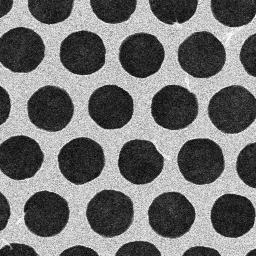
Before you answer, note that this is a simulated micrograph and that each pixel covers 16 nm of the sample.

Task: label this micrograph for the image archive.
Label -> a regular array of holes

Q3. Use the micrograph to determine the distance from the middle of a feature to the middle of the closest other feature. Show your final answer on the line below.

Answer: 949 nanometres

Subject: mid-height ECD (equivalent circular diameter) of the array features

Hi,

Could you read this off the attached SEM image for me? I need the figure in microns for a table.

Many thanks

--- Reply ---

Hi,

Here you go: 0.732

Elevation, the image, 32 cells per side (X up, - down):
--X------XX------XX------X------
-XXX-----XXX-----XX-----XXX-----
XXXXX---XXXXX---XXXX---XXXX----X
XX-XXXXXXXXXXXXXXXXXXXXXXXXXXXXX
-----XXX----XXXX---XXXXX---XXXX-
-----XXX-----XX-----XXX-----XX--
------XX-----XX------X------XX--
-----XXX-----XX-----XX------XX--
X----XXX-----XX-----XXX-----XX--
XXXXXXXXXXXXXXXXX--XXXXX---XXXXX
XXXXXXXXXXXXXXXXXXXXXXXXXXXXXXXX
-XXXX---XXXX----XXXX----XXX----X
-XXX-----XX------XX------X------
-XX------XX------XX------X------
-XXX-----XX------XX------X------
XXXX----XXXX----XXXX----XXX----X
XXXXXXXXXXXXXXXXXXXXXXXXXXXX--XX
X---XXXXX---XXXX--XXXXXX--XXXXXX
-----XXX-----XX-----XXX----XXX--
-----XX------XX-----XX------XX--
-----XX------XX-----XX------X---
-----XXX-----XX-----XXX-----XX--
XXXXXXXX----XXXX---XXXX----XXX--
XXXXXXXXXXXXXXXXXXXXXXXXXXXXXXXX
-XXX---XXXXX----XXXX---XXXXX--XX
-XX-----XXX------XX-----XXX----X
-XX------XX------X------XX------
-XX-----XXX-----XXX-----XX------
XXX-----XXX-----XXX-----XXX----X
XXXXX-XXXXXXX-XXXXXX--XXXXXX--XX
XXXXXXXXXXXXXXXX---XXXXXXXXXXXXX
----XXXX----XXX-----XXX----XXXX-